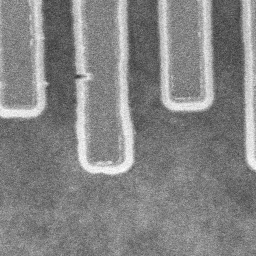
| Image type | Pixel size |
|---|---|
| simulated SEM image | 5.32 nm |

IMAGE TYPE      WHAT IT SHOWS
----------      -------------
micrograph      one or a few lines or trenches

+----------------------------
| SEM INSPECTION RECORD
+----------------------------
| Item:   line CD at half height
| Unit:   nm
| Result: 240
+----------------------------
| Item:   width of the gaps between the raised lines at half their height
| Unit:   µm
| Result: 0.21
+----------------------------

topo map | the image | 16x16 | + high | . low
++...+++..+++..+
++...+++..+++..+
+++..+++..+++..+
++...+++..+++...
++...+++..+++...
+++..+++..+++...
+++..+++...++...
.....+++........
.....+++........
.....+++........
......++........
................
................
................
................
................